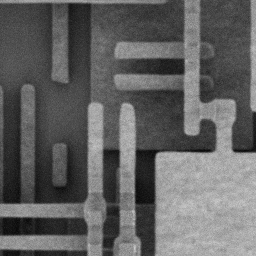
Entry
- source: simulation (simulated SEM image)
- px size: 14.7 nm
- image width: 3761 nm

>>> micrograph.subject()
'wiring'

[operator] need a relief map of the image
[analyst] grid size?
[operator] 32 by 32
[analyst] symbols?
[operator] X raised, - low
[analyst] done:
-----------------------XX------X
-----------------------XX-------
-----------------------XX-------
-----------------------XX-------
-----------------------XX------X
---------------XXXXXXXXXXX-----X
--------------XXXXXXXXXXXXX----X
-----------------------XX------X
-----------------------XX------X
---------------XXXXXXXXXXX------
--------------XXXXXXXXXXXXX----X
-----------------------XX------X
-----------------------XX--XX--X
-----------XX--XX------XXXXXX--X
-----------XX--XX------XXXXXX---
-----------XX--XX------XX--XX---
-----------XX--XX------XX--XX---
-----------XX--XX----------XX---
-----------XX--XX----------XX---
-----------XX--XX---XXXXXXXXXXXX
-----------XX--XX--XXXXXXXXXXXXX
-----------XX--XX--XXXXXXXXXXXXX
-----------XX--XX--XXXXXXXXXXXXX
-----------XX--XX--XXXXXXXXXXXXX
-----------XX--XX--XXXXXXXXXXXXX
----XXXXXXXXXXXXX--XXXXXXXXXXXXX
XXXXXXXXXXXXXXXXXX-XXXXXXXXXXXXX
-----------XX--XX--XXXXXXXXXXXXX
-----------XX--XX--XXXXXXXXXXXXX
-XXXXXXXXXXXXXXXX--XXXXXXXXXXXXX
XXXXXXXXXXXXXXXXXX-XXXXXXXXXXXXX
-----------XX-XXX--XXXXXXXXXXXXX